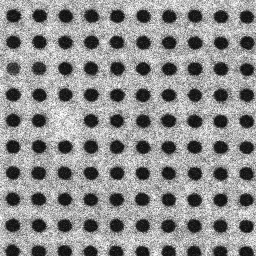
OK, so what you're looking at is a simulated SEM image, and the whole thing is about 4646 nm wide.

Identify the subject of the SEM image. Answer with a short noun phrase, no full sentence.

a regular array of holes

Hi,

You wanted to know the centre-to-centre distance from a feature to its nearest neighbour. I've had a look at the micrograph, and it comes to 0.468 microns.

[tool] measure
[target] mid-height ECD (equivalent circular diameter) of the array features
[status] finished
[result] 258 nm